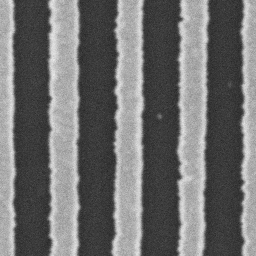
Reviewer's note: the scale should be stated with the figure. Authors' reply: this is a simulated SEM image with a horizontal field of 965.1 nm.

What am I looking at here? lines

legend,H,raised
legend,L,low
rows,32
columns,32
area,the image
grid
HHLLLLHHHHLLLLLHHHLLLLLHHHLLLLLH
HHLLLLHHHHLLLLLHHHLLLLLHHHLLLLLH
HHLLLLHHHHLLLLLHHHLLLLLHHHLLLLHH
HHLLLLLHHHLLLLLHHHLLLLHHHHLLLLHH
HHLLLLHHHHLLLLLHHHLLLLLHHHLLLLHH
HLLLLLHHHHLLLLLHHHLLLLLHHHLLLLHH
HLLLLLHHHHLLLLLHHHLLLLLHHHLLLLHH
HHLLLLHHHHLLLLLHHHLLLLHHHHLLLLHH
HHLLLLHHHHLLLLLHHHLLLLLHHHLLLLHH
HHLLLLHHHHLLLLLHHHLLLLLHHHLLLLHH
HHLLLLHHHHLLLLLHHHLLLLLHHHLLLLHH
HHLLLLHHHHLLLLHHHHLLLLLHHHLLLLHH
HHLLLLHHHHLLLLLHHHLLLLLHHHLLLLLH
HHLLLLHHHHLLLLLHHHLLLLLHHHLLLLHH
HHLLLLHHHHLLLLHHHHLLLLLHHHLLLLHH
HHLLLLHHHHLLLLLHHHLLLLLHHHLLLLHH
HHLLLLHHHHLLLLLHHHLLLLLHHHLLLLHH
HHLLLLHHHHLLLLHHHHLLLLHHHHLLLLHH
HHLLLLHHHHLLLLHHHHLLLLHHHLLLLLLH
HHLLLLHHHHLLLLLHHHLLLLHHHLLLLLLH
HHLLLLHHHHLLLLLHHHLLLLLHHLLLLLHH
HHLLLLHHHHLLLLLHHHLLLLLHHHLLLLHH
HHLLLLHHHHLLLLHHHHLLLLLHHHLLLLLH
HHLLLLHHHHLLLLHHHHLLLLHHHLLLLLHH
HHLLLLHHHHLLLLHHHHLLLLLHHLLLLLLH
HHLLLLHHHHLLLLHHHHLLLLHHHLLLLLHH
HHLLLLHHHHLLLLHHHHLLLLLHHLLLLLHH
HHLLLLHHHHLLLLHHHHLLLLLHHLLLLLHH
HHLLLLHHHHLLLLHHHHLLLLLHHHLLLLHH
HHLLLLHHHHLLLLHHHHLLLLLHHLLLLLHH
HHLLLLLHHHLLLLHHHLLLLLHHHLLLLLLH
HHLLLLHHHHLLLLHHHLLLLLHHHLLLLLHH